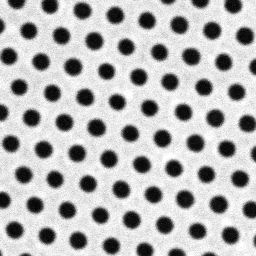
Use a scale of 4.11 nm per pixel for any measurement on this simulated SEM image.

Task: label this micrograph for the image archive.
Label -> a regular array of holes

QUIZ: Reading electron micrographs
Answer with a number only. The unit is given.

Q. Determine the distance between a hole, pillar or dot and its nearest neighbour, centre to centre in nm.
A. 132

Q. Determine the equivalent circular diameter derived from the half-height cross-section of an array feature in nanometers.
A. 69.3